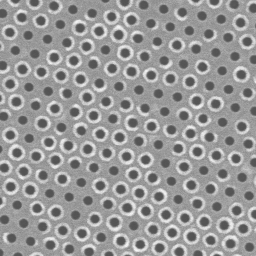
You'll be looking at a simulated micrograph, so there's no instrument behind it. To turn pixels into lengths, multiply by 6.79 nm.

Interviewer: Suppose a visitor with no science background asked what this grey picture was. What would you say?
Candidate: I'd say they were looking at a regular array of holes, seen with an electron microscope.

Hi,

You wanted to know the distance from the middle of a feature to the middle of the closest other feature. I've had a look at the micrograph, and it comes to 130 nm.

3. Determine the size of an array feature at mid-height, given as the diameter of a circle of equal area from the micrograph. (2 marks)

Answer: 9.37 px